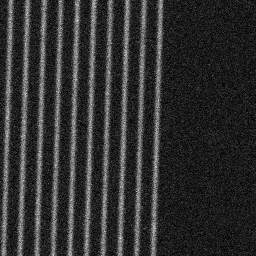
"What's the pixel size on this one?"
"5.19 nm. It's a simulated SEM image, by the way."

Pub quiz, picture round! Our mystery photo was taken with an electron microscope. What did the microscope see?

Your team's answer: parallel lines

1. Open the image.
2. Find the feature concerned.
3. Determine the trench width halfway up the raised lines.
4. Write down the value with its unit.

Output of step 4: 71.3 nm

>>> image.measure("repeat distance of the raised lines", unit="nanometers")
86.2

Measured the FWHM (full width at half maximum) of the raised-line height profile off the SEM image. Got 13.6 nanometers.